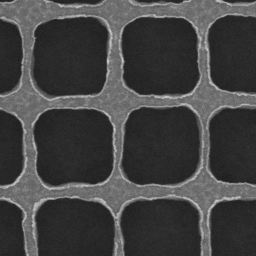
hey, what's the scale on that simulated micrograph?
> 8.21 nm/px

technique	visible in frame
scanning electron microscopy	holes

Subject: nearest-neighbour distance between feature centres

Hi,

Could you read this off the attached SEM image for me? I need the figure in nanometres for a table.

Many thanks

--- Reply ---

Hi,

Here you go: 727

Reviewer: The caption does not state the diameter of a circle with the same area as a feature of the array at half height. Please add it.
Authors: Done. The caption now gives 0.691 microns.